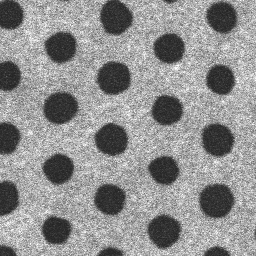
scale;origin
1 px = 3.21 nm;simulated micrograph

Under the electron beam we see a regular array of holes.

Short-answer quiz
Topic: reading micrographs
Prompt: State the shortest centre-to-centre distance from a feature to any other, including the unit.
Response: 193 nm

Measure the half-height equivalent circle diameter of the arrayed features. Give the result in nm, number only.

101